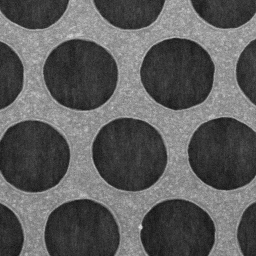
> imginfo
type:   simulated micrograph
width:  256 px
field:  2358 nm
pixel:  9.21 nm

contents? holes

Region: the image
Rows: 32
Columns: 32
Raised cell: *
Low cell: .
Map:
.........***........****........
........****........****........
*......******.......******.....*
***...*********...*********..***
********************************
.******.....*******......******.
..****........****........****..
...***........****.........***..
...**..........***.........**...
...**..........**..........**...
...***.........***.........***..
...***........****........****..
..*****......******.......*****.
.********...*********..*********
********************************
**....*******......******......*
*......*****........****........
........****........****........
.........***.........**.........
.........***.........***........
.........***.........***........
........****........****........
*.......*****.......*****......*
**....*********....********...**
********************************
********.....*******....*******.
..****........****........*****.
..****.........***.........***..
...***.........***.........***..
...***.........**..........***..
...***.........***.........***..
...***.........***........****..